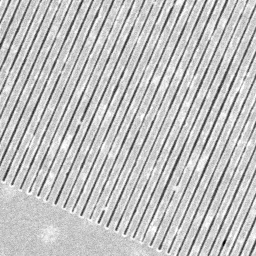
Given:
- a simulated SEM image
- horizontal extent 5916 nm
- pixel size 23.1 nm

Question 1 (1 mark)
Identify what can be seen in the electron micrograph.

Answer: parallel lines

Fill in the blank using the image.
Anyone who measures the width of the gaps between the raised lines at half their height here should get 71.5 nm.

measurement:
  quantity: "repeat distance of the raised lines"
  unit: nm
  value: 219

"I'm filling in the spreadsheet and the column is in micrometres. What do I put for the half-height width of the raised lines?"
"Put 0.143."